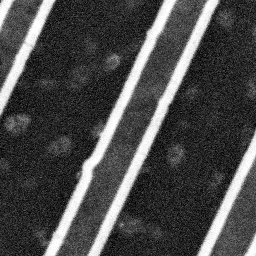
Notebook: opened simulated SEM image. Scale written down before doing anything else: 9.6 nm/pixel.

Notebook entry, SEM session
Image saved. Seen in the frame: one or a few lines or trenches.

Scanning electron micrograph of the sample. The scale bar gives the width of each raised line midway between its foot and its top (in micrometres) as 0.382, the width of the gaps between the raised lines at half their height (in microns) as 0.954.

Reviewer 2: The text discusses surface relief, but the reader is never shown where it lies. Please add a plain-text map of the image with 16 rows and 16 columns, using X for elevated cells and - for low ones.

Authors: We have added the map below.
XXX-------XXX---
XX--------XXX---
XX-------XXX----
X--------XXX----
X-------XXX-----
X-------XXX-----
--------XX------
-------XXX------
-------XX-------
------XXX-------
------XX-------X
-----XXX-------X
-----XX-------XX
----XXX-------XX
----XXX------XXX
---XXX-------XXX